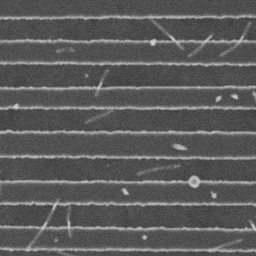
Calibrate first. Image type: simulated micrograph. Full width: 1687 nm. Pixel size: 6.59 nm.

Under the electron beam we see lines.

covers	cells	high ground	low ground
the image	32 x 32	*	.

********************************
********************************
................................
................................
................................
********************************
********************************
********************************
................................
................................
................................
********************************
********************************
****.***********.********.******
................................
................................
*************.******.*..****....
********************************
********************************
********************************
................................
................................
........................*.......
********************************
********************************
****.******.********************
................................
................................
***********.***..*..*..........*
********************************
********************************
................................